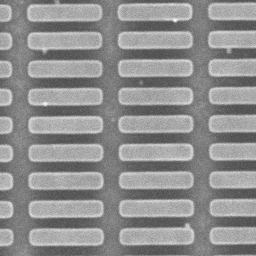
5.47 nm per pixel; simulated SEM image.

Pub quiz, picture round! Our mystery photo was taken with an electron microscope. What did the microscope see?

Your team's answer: groups of lines, slits or small figures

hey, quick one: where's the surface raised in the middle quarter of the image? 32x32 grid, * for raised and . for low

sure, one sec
*********.....******************
*********.....******************
*********.....******************
................................
................................
................................
*********.....******************
*********.....******************
*********.....******************
*********.....******************
................................
................................
................................
*********.....******************
**********....******************
**********....******************
*********.....******************
................................
................................
................................
*********.....******************
**********....******************
**********....******************
**********....******************
................................
................................
................................
*********.....******************
**********....******************
**********....******************
**********....******************
................................